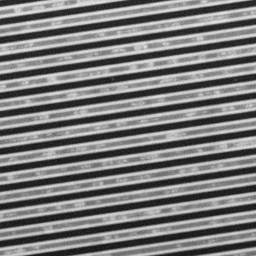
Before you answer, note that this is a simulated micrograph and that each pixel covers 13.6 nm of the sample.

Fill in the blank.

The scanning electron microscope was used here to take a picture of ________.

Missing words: parallel lines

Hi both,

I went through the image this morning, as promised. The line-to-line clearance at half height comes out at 141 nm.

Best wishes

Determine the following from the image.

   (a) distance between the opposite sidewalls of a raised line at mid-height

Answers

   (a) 106 nanometres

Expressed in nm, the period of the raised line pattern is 248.